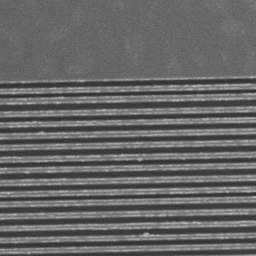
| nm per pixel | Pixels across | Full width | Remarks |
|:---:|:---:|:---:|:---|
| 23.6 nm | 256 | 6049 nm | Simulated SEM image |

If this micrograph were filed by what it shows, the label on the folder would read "parallel lines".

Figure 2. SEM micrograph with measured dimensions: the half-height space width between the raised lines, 127 nm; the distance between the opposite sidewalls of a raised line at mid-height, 145 nm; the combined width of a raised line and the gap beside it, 269 nm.